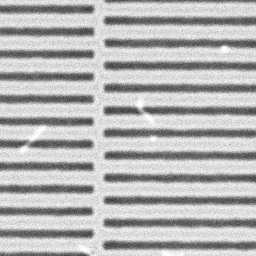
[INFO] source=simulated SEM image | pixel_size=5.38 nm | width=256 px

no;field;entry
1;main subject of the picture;groups of lines, slits or small figures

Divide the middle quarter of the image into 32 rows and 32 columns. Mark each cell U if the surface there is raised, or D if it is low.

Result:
UUUUUUUUUUDDDDDDDDDDDDDDDDDDDDDD
UUUUUUUUUUDDDDDDDDDDDDDDDDDDDDDD
DDDDDDDDUUUUUUUUUUUUUUUUUUUUUUUU
DDDDDDDDUUUUUUUUUUUUUUUUUUUUUUUU
UUDDUDDUUUUUUUUUUUUUUUUUUUUUUUUU
UUUUUUUUUUDDDDDDDDDDDDDDDDDDDDDD
UUUUUUUUUUDDDDDDDDDDDDDDDDDDDDDD
UUDDDUUUUUUUUUUUUUUUUUUUUUUUUUUU
DDDDDDDDUUUUUUUUUUUUUUUUUUUUUUUU
DDDDDDDDUUUUUUUUUUUUUUUUUUUUUUUU
UUUUUUUUUUDDDDDDUUUUUUUDDDDDUUUU
UUUUUUUUUUDDDDDDDDDUDDDDDDDDDDDD
UUUUUUUUUUDDDDDDDDDDUDDDDDDDDDDD
DDDDDDDDUUUUUUUUUUUUUUUUUUUUUUUU
DDDDDDDDUUUUUUUUUUUUUUUUUUUUUUUU
DDDDDDDDUUUUUUUUUUUUUUUUUUUUUUUU
UUUUUUUUUUDDDDDDDDDDDDDDDDDDDDDD
UUUUUUUUUUDDDDDDDDDDDDDDDDDDDDDD
UUUUUUUUUUDDDDDDDDDDDDUDDDDUDDDD
DDDDDDDDUUUUUUUUUUUUUUUUUUUUUUUU
DDDDDDDDUUUUUUUUUUUUUUUUUUUUUUUU
UUUUUUUUUUUUDDUUDUUUUUUUDDUUUUDD
UUUUUUUUUUDDDDDDDDDDDDDDDDDDDDDD
UUUUUUUUUUDDDDDDDDDDDDDDDDDDDDDD
DDDDDDDUUUUUUUUUUUUUUUUUUUUUUUUU
DDDDDDDDUUUUUUUUUUUUUUUUUUUUUUUU
DDDDDDDDUUUUUUUUUUUUUUUUUUUUUUUU
UUUUUUUUUUDDDDDDDDDDDDDDDDDDDDDD
UUUUUUUUUUDDDDDDDDDDDDDDDDDDDDDD
UUUUUUUUUUDDDDDDDDDDDDDDDDDDDDDD
DDDDDDDDUUUUUUUUUUUUUUUUUUUUUUUU
DDDDDDDDUUUUUUUUUUUUUUUUUUUUUUUU